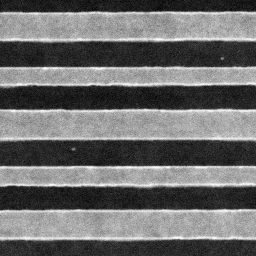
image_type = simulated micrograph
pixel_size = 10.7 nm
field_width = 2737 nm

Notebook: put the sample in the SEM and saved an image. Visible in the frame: lines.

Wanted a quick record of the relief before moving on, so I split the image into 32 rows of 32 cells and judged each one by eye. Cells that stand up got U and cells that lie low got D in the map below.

DDDDDDDDDDDDDDDDDDDDDDDDDDDDDDDD
DDDDDDDDDDDDDDDDDDDDDDDDDDDDDDDD
UUUUUUUUUUUUUUUUUUUUUUUUUUUUUUUU
UUUUUUUUUUUUUUUUUUUUUUUUUUUUUUUU
UUUUUUUUUUUUUUUUUUUUUUUUUUUUUUUU
DDDDDDDDDDDDDDDDDDDDDDDDDDDDDDDD
DDDDDDDDDDDDDDDDDDDDDDDDDDDDDDDD
DDDDDDDDDDDDDDDDDDDDDDDDDDDDDDDD
DDDDDDDDDDDDDDDDDDDDDDDDDDDDDDDD
UUUUUUUUUUUUUUUUUUUUUUUUUUUUUUUU
UUUUUUUUUUUUUUUUUUUDDDUUUUUDDDDD
DDDDDDDDDDDDDDDDDDDDDDDDDDDDDDDD
DDDDDDDDDDDDDDDDDDDDDDDDDDDDDDDD
DDDDDDDDDDDDDDDDDDDDDDDDDDDDDDDD
UUUUUUUUUUUUUUUUUUUUUUUUUUUUUUUU
UUUUUUUUUUUUUUUUUUUUUUUUUUUUUUUU
UUUUUUUUUUUUUUUUUUUUUUUUUUUUUUUU
DDDDDDDDDDDDDDDDDDDDDDDDDDDDDDDD
DDDDDDDDDDDDDDDDDDDDDDDDDDDDDDDD
DDDDDDDDDDDDDDDDDDDDDDDDDDDDDDDD
DDDDDDDDDDDDDDDDDDDDDDDDDDDDDDDD
UUUUUUUUUUUUUUUUUUUUUUUUUUUUUUUU
UUUUUUUUUUUUUUUUUUUUUUUUUUUUUUUU
DDDDDDDDDDDDDDDDDDDDDDDDDDDDDDDD
DDDDDDDDDDDDDDDDDDDDDDDDDDDDDDDD
DDDDDDDDDDDDDDDDDDDDDDDDDDDDDDDD
UUUUUUUUUUUUUUUUUUUUUUUUUUUUUUUU
UUUUUUUUUUUUUUUUUUUUUUUUUUUUUUUU
UUUUUUUUUUUUUUUUUUUUUUUUUUUUUUUU
UUUUUUUUUUUUUUUUUUUUUUUUUUUUUUUU
DDDDDDDDDDDDDDDDDDDDDDDDDDDDDDDD
DDDDDDDDDDDDDDDDDDDDDDDDDDDDDDDD